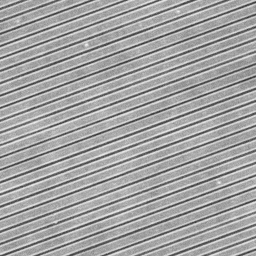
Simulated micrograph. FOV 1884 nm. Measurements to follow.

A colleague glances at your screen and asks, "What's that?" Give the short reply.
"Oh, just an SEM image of parallel lines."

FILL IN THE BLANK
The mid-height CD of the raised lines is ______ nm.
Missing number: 63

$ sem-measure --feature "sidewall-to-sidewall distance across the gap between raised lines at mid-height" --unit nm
21.6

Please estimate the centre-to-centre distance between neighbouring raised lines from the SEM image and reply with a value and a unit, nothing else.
85.5 nm